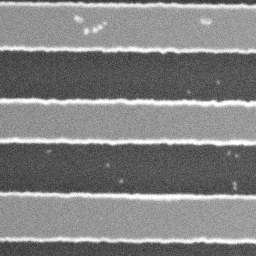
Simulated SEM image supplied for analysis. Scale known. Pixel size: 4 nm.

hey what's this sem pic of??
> lines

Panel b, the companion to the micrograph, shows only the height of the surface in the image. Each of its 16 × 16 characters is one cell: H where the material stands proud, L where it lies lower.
HHHHHHHHHHHHHHHH
HHHHHHHHHHHHHHHH
HHHHHHHHHHHHHHHH
LLLLLLLLLLLLLLLL
LLLLLLLLLLLLLLLL
LLLLLLLLLLLLLLLL
HHHHHHHHHHHHHHHH
HHHHHHHHHHHHHHHH
HHHHHHHHHHHHHHHH
LLLLLLLLLLLLLLLL
LLLLLLLLLLLLLLLL
LLLLLLLLLLLLLLLL
HHHHHHHHHHHHHHHH
HHHHHHHHHHHHHHHH
HHHHHHHHHHHHHHHH
LLLLLLLLLLLLLLLL